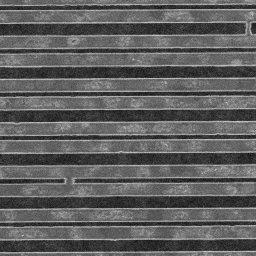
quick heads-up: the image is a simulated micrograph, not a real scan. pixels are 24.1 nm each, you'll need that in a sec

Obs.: parallel lines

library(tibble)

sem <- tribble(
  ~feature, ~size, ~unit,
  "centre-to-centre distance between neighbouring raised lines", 21.7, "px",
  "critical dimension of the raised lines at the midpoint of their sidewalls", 0.31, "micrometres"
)